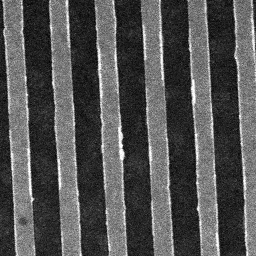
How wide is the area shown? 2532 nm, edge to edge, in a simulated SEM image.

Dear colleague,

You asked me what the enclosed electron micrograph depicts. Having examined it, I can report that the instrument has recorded parallel lines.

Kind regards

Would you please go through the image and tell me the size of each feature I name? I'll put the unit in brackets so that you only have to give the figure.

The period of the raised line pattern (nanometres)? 455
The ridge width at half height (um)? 0.185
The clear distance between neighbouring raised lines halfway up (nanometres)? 270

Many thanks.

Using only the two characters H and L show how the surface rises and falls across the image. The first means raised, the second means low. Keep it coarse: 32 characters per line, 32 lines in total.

HHHLLLHHLLLLHHLLLLHHLLLLHHLLLHHH
HHHLLLHHHLLLHHLLLLHHLLLLHHLLLHHH
LHHLLLHHHLLLHHLLLLHHLLLLHHLLLHHH
LHHLLLHHHLLLHHLLLLHHLLLLHHLLLHHH
LHHLLLHHHLLLHHLLLLHHLLLLHHLLLHHH
LHHLLLHHHLLLHHLLLLHHLLLLHHLLLLHH
LHHLLLLHHLLLHHHLLLHHLLLLHHLLLHHH
LHHLLLLHHLLLHHHLLLHHLLLLHHLLLHHH
LHHLLLLHHLLLHHHLLLHHLLLLHHLLLLHH
LHHLLLLHHLLLHHHLLLHHLLLLHHLLLLHH
LHHLLLLHHLLLHHHLLLHHLLLLHHLLLLHH
LHHLLLLHHLLLLHHLLLHHHLLLHHLLLLHH
LHHLLLLHHLLLLHHLLLHHHLLLHHLLLLHH
LHHLLLLHHLLLLHHLLLHHHLLLHHLLLLHH
LHHHLLLHHLLLLHHLLLHHHLLLHHHLLLHH
LHHHLLLHHLLLLHHLLLHHHLLLHHHLLLHH
LHHHLLLHHLLLLHHLLLLHHLLLHHHLLLHH
LHHHLLLHHLLLLHHLLLLHHLLLHHHLLLHH
LHHHLLLHHLLLLHHLLLLHHLLLHHHLLLHH
LHHHLLLHHLLLLHHLLLLHHLLLLHHLLLHH
LHHHLLLHHLLLLHHLLLLHHLLLLHHLLLHH
LLHHLLLHHHLLLHHLLLLHHLLLLHHLLLHH
HHHHLLLHHHLLLHHLLLLHHLLLLHHLLLHH
LLHHLLLHHHLLLHHLLLLHHLLLLHHLLLLH
LLHHLLLHHHLLLHHLLLLHHLLLLHHLLLLH
LLHHLLLLHHLLLHHHLLLHHLLLLHHLLLLH
LLHHLLLLHHLLLHHHLLLHHLLLLHHLLLLH
LLHHLLLLHHLLLHHHLLLHHLLLLHHLLLLH
LLHHLLLLHHLLLHHHLLLHHLLLLHHLLLLH
LLHHLLLLHHLLLHHHLLLHHHLLLHHLLLLH
LLHHLLLLHHLLLHHHLLLHHHLLLHHLLLLH
LLHHLLLLHHLLLLHHLLLHHHLLLHHLLLLH